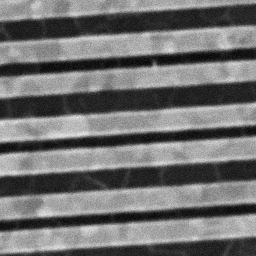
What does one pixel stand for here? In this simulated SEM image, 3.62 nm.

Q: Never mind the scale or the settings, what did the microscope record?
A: parallel lines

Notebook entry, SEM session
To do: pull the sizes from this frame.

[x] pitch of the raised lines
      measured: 136 nanometres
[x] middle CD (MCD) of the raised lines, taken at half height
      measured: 0.0695 µm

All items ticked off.